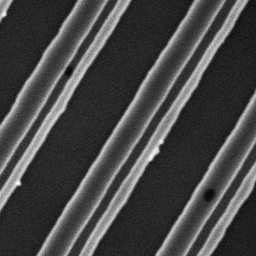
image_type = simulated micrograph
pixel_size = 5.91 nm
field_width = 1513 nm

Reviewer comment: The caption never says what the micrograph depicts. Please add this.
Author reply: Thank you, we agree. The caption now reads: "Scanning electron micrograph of lines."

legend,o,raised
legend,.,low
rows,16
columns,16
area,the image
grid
.....ooo....ooo.
....ooo....oooo.
...oooo....ooo..
...ooo....ooo...
..ooo....oooo...
.oooo....ooo....
.ooo....oooo....
ooo.....ooo....o
ooo....ooo....oo
oo....oooo....oo
oo....ooo....ooo
o....ooo.....ooo
....oooo....ooo.
....ooo....oooo.
...oooo....ooo..
...ooo....ooo...